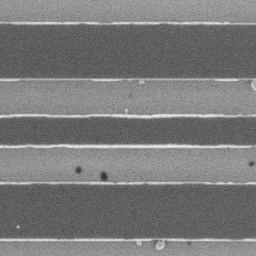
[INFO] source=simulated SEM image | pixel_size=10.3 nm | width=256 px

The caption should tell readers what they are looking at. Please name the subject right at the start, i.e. lines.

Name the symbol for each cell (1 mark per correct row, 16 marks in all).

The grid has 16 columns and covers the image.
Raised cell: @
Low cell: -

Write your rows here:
----------------
@@@@@@@@@@@@@@@@
@@@@@@@@@@@@@@@@
@@@@@@@@@@@@@@@@
@@@@@@@@@@@@@@@@
----------------
----------------
@@@@@@@@@@@@@@@@
@@@@@@@@@@@@@@@@
----------------
----------------
@@@@@@@@@@@@@@@@
@@@@@@@@@@@@@@@@
@@@@@@@@@@@@@@@@
@@@@@@@@@@@@@@@@
----------------